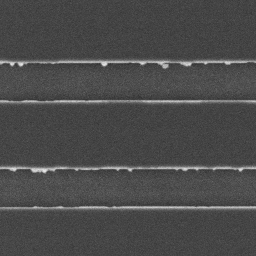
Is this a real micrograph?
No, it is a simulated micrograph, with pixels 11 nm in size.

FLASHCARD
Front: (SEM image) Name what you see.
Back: lines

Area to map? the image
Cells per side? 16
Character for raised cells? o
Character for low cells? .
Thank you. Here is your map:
oooooooooooooooo
oooooooooooooooo
oooooooooooooooo
oooooooooooooooo
................
................
oooooooooooooooo
oooooooooooooooo
oooooooooooooooo
oooooooooooooooo
oooooooooooooooo
................
................
oooooooooooooooo
oooooooooooooooo
oooooooooooooooo